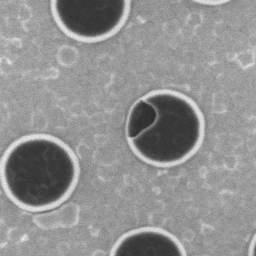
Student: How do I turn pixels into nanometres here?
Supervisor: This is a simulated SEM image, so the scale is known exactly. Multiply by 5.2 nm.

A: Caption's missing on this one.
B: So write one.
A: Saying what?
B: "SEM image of raised bodies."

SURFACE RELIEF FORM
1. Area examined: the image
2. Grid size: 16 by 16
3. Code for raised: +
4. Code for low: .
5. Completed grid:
...+++++........
....++++........
................
................
................
................
.........+++....
..........+++...
........+++++...
.+++....++++....
+++++...........
+++++...........
.+++............
................
........++......
.......++++.....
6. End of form